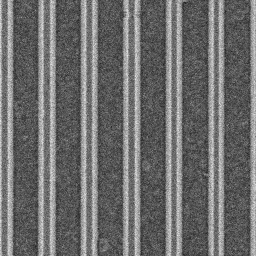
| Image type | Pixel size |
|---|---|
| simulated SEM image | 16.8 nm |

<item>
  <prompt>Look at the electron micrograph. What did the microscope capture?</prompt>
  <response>parallel lines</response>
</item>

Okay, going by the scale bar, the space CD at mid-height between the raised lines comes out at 520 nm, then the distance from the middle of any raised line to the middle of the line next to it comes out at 712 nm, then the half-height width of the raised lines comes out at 11.2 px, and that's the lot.